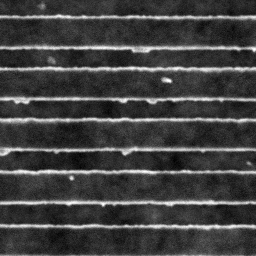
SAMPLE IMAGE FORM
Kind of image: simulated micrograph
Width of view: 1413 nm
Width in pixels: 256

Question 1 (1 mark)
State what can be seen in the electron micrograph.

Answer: lines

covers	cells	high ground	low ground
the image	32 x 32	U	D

DDDDDDDDDDDDDDDDDDDDDDDDDDDDDDDD
DDDDDDDDDDDDDDDDDDDDDDDDDDDDDDDD
UUUUUUUUUUUUUUUUUUUUUUUUUUUUUUUU
UUUUUUUUUUUUUUUUUUUUUUUUUUUUUUUU
UUUUUUUUUUUUUUUUUUUUUUUUUUUUUUUU
UUUUUUUUUUUUUUUUUUUUUUUUUUUUUUUU
DDDDDDDDDDDDDDDDDDDDDDDDDDDDDDDD
DDDDDDDDDDDDDDDDDDDDDDDDDDDDDDDD
DDDDDUUUDDUDDDDUUUDDDDUDDDDDDDDD
UUUUUUUUUUUUUUUUUUUUUUUUUUUUUUUU
UUUUUUUUUUUUUUUUUUUUUUUUUUUUUUUU
UUUUUUUUUUUUUUUUUUUUUUUUUUUUUUUU
DDUUDDDDDDDDDDDDDDUUUDDDDDDDDUUU
DDDDDDDDDDDDDDDDDDDDDDDDDDDDDDDD
DDDDDDDDDDDDDDDDDDDDDDDDDDDDDDDD
UUUUUUUUUUUUUUUUUUUUUUUUUUUUUUUU
UUUUUUUUUUUUUUUUUUUUUUUUUUUUUUUU
UUUUUUUUUUUUUUUUUUUUUUUUUUUUUUUU
UUUUUUUUUUUUUUUUUUUUUUUUUUUUUUUU
DDDDDDDDDDDDDDDDDDDDDDDDDDDDDDDD
DDDDDDDDDDDDDDDDDDDDDDDDDDDDDDDD
UUUUUUUUUUUUUUUUUUUUUUUUUUUUUUUU
UUUUUUUUUUUUUUUUUUUUUUUUUUUUUUUU
UUUUUUUUUUUUUUUUUUUUUUUUUUUUUUUU
UUUUUUUUUUUUUUUUUUUUUUUUUUUUUUUU
DDDDDDDDDDDDDDDDDDDDDDDDDDDDDDDD
DDDDDDDDDDDDDDDDDDDDDDDDDDDDDDDD
DDDDDDDDDDDDDDDDDDDDDDDDDDDDDDDD
UUUUUUUUUUUUUUUUUUUUUUUUUUUUUUUU
UUUUUUUUUUUUUUUUUUUUUUUUUUUUUUUU
UUUUUUUUUUUUUUUUUUUUUUUUUUUUUUUU
UUUUUUUUUUUUUUUUUUUUUUUUUUUUUUUU